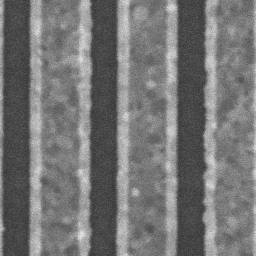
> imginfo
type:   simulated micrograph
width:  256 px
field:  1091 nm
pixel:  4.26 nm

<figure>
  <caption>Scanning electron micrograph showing one or a few lines or trenches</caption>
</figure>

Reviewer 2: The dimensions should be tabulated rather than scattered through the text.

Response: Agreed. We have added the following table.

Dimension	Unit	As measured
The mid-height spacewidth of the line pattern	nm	159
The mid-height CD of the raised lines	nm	212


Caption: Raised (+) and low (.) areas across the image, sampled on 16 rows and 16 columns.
..+++...+++..+++
..+++...+++..+++
..+++...+++..+++
..+++...+++..+++
..+++...+++..+++
..+++...+++..+++
..+++...+++..+++
..+++...+++..+++
..+++...+++..+++
..+++...+++..+++
..+++...+++..+++
..+++...+++..+++
..+++...+++..+++
..+++...+++..+++
..+++...+++..+++
..+++...+++..+++